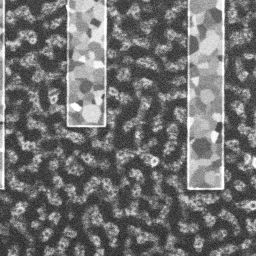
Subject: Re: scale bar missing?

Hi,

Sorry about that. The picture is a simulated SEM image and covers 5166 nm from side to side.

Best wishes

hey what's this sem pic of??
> one or a few lines or trenches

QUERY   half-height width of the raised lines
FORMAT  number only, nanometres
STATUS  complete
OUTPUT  722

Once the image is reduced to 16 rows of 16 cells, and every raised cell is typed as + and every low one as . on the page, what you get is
....+++.....++..
....+++.....++..
....+++.....++..
....+++.....++..
....+++.....++..
....+++.....++..
....+++.....++..
....++......++..
............++..
............++..
............++..
............++..
................
................
................
................